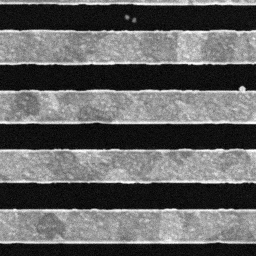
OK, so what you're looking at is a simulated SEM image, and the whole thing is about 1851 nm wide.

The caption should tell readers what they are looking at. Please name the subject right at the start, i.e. lines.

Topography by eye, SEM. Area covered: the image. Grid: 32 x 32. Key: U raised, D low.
DDDDDDDUUUDUUDDDDUUUUUUUUUDUUUUU
DDDDDDDDDDDDDDDDDDDDDDDDDDDDDDDD
DDDDDDDDDDDDDDDDDDDDDDDDDDDDDDDD
DDDDDDDDDDDDDDDDDDDDDDDDDDDDDDDD
UUUUUUUUUUUUUUUUUUUUUUUUUUUUUUUU
UUUUUUUUUUUUUUUUUUUUUUUUUUUUUUUU
UUUUUUUUUUUUUUUUUUUUUUUUUUUUUUUU
UUUUUUUUUUUUUUUUUUUUUUUUUUUUUUUU
DDDDDDDDDDDDDDDDDDDDDDDDDDDDDDDD
DDDDDDDDDDDDDDDDDDDDDDDDDDDDDDDD
DDDDDDDDDDDDDDDDDDDDDDDDDDDDDDDD
UUUUUUUUUUUUUUUUUUUUUUUUUUUUUUUU
UUUUUUUUUUUUUUUUUUUUUUUUUUUUUUUU
UUUUUUUUUUUUUUUUUUUUUUUUUUUUUUUU
UUUUUUUUUUUUUUUUUUUUUUUUUUUUUUUU
DDDDDDDDDDDDDDDDDDDDDDDDDDDDDDDD
DDDDDDDDDDDDDDDDDDDDDDDDDDDDDDDD
DDDDDDDDDDDDDDDDDDDDDDDDDDDDDDDD
DDDDDDDDDDDDDDDDDDDDDDDDDDDDDDDD
UUUUUUUUUUUUUUUUUUUUUUUUUUUUUUUU
UUUUUUUUUUUUUUUUUUUUUUUUUUUUUUUU
UUUUUUUUUUUUUUUUUUUUUUUUUUUUUUUU
UUUUUUUUUUUUUUUUUUUUUUUUUUUUUUUU
DDDDDDDDDDDDDDDDDDDDDDDDDDDDDDDD
DDDDDDDDDDDDDDDDDDDDDDDDDDDDDDDD
DDDDDDDDDDDDDDDDDDDDDDDDDDDDDDDD
UUUUUUUUUUUUUUUUUUUUUUUUUUUUUUUU
UUUUUUUUUUUUUUUUUUUUUUUUUUUUUUUU
UUUUUUUUUUUUUUUUUUUUUUUUUUUUUUUU
UUUUUUUUUUUUUUUUUUUUUUUUUUUUUUUU
DDDDDDDDDDDDDDDDDDDDDDDDDDDDDDDD
DDDDDDDDDDDDDDDDDDDDDDDDDDDDDDDD